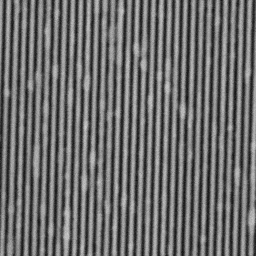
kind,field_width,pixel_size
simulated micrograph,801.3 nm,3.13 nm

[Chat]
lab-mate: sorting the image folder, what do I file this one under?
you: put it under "parallel lines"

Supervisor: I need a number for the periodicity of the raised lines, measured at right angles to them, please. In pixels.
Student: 8.02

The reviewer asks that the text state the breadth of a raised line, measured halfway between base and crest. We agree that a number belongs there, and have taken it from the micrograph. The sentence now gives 0.0145 µm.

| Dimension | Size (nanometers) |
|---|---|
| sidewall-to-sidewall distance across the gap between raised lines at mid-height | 11.4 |